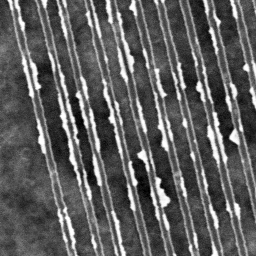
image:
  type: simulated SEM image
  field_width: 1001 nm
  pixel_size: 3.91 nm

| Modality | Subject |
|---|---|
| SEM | parallel lines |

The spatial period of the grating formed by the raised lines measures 93 nanometers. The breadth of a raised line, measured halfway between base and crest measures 32.8 nm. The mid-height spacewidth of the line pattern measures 59 nm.